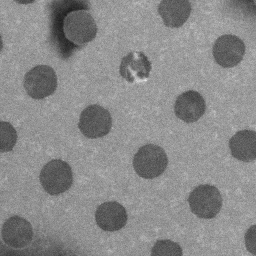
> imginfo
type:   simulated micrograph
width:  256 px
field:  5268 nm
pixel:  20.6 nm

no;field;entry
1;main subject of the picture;a regular array of raised bodies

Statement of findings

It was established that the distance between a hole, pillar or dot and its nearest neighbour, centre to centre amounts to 1390 nm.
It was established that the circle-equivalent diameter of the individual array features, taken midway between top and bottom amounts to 730 nanometres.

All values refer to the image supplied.